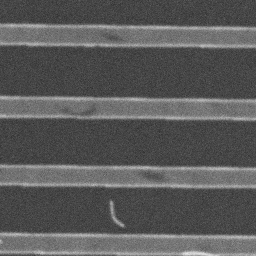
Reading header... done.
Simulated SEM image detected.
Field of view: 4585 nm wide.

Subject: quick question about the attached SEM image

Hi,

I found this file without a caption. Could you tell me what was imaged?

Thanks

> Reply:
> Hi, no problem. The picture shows lines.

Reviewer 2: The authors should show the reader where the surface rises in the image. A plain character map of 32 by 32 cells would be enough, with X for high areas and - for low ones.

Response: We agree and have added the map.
--------------------------------
--------------------------------
--------------------------------
XXXXXXXXXXXXXXXXXXXXXXXXXXXXX---
XXXXXXXXXXXXXXXXXXXXXXXXXXXXXXXX
XXXXXXXXXXXXXXXXXXXXXXXXXXXXXXXX
--------------------------------
--------------------------------
--------------------------------
--------------------------------
--------------------------------
--------------------------------
XXXXXXXXXXXXXXXXXXXXXXXXXX------
XXXXXXXXXXXXXXXXXXXXXXXXXXXXXXXX
XXXXXXXXXXXXXXXXXXXXXXXXXXXXXXXX
--------------------------------
--------------------------------
--------------------------------
--------------------------------
--------------------------------
--------------------------------
XXXXXXXXXXXXXXXXXXXXXXXXXXXXXXXX
XXXXXXXXXXXXXXXXXXXXXXXXXXXXXXXX
--------------------------------
--------------------------------
--------------------------------
--------------------------------
--------------------------------
--------------------------------
XXXXXXXXXXXXXXXXXXXX------------
XXXXXXXXXXXXXXXXXXXXXXXXXXXXXXXX
XXXXXXXXXXXXXXXXXXXXXXXXXXXXXXXX